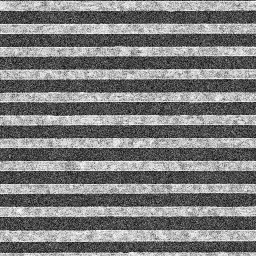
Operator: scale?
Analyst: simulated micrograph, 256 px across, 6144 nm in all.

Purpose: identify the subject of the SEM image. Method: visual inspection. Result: parallel lines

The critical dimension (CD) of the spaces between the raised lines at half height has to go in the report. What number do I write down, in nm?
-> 330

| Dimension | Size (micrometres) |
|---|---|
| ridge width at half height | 0.228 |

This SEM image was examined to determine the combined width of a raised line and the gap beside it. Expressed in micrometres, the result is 0.552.